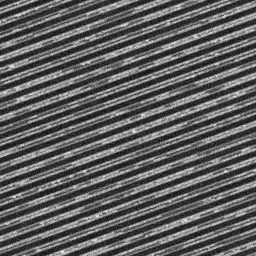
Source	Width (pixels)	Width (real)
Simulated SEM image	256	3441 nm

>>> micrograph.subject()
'parallel lines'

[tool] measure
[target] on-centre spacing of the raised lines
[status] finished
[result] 152 nanometres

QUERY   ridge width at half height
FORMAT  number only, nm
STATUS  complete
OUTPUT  71.2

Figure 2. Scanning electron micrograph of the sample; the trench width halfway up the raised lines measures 0.0838 um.